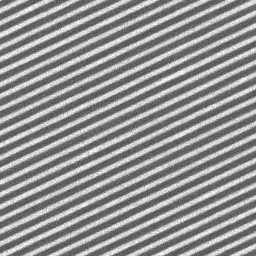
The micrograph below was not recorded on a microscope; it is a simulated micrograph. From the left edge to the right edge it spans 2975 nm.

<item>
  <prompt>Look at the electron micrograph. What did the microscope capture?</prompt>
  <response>parallel lines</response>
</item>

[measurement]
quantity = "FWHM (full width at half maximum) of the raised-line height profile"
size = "4.86 pixels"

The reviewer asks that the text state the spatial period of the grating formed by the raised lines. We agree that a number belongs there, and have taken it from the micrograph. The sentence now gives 129 nm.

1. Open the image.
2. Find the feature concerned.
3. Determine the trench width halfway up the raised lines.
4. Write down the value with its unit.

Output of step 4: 5.89 px